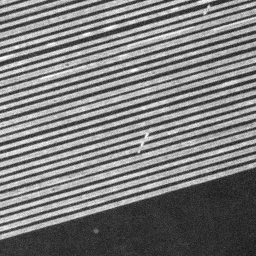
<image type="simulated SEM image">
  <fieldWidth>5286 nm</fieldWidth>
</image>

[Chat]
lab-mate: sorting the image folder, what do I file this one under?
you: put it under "parallel lines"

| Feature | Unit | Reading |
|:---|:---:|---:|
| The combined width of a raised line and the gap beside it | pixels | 7.76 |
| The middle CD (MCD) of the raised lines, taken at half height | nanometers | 81.9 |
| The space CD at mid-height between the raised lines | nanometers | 81.9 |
